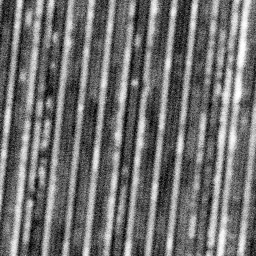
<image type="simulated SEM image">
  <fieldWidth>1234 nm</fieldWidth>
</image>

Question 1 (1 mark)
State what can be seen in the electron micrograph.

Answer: parallel lines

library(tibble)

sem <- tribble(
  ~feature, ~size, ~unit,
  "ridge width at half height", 16.1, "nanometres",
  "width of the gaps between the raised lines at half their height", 8.4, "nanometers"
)